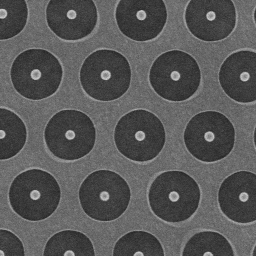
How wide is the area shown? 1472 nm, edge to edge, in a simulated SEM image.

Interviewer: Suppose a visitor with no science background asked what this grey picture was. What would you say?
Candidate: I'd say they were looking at an array of small figures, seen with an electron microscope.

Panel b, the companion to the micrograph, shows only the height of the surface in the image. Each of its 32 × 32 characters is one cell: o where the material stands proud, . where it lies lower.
...ooo......ooo......oo......ooo
o...oo......oo...o...oo......ooo
...ooo......oo.......oo.......oo
...ooo......ooo.....ooo......ooo
..ooooo....ooooo....oooo....oooo
oooooooooooooooooooooooooooooooo
ooo...oooooo..ooooooo..oooooo...
oo.....oooo.....ooo.....oooo....
o.......oo......ooo......ooo....
o...o...oo...o..ooo..o...oo...o.
oo......oo......ooo......ooo....
oo.....oooo.....ooo......ooo....
oooo.ooooooo..ooooooo..oooooo...
.ooooooooooooooooooooooooooooooo
..ooooo....oooo.....oooo....oooo
...ooo......ooo.....ooo......ooo
...ooo......oo.......oo......ooo
...ooo......oo.......oo......ooo
...ooo......ooo.....ooo......ooo
..oooo.....oooo.....oooo....oooo
oooooooooooooooooooooooooooooooo
ooo...oooooo..oooooo...ooooooo.o
oo.....ooo......ooo.....oooo....
o......ooo......ooo......oo.....
o...o...oo......oo...o...oo...o.
o......ooo......ooo......oo.....
oo.....oooo....oooo.....oooo....
ooo..ooooooo..oooooo....ooooo...
oooooooooooooooooooooooooooooooo
..ooooo....oooo....ooooo....oooo
...ooo.....ooo......ooo......ooo
...oo...o...oo......ooo......ooo